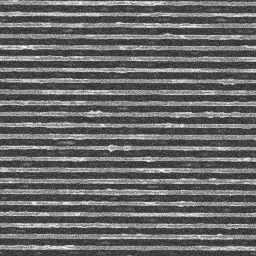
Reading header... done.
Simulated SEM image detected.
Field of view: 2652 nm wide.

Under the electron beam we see parallel lines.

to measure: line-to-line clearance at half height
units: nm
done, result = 75.1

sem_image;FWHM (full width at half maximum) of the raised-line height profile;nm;46.6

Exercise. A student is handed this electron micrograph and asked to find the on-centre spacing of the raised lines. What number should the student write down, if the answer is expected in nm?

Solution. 115